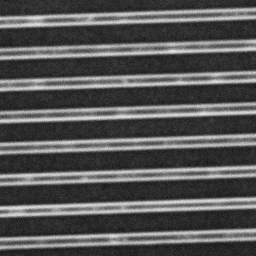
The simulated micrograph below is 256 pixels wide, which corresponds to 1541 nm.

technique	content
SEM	parallel lines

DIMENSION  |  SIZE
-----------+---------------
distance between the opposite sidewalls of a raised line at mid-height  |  0.0511 microns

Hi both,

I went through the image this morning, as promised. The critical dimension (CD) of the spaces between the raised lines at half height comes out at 138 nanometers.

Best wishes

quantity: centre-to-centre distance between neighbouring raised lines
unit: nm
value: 190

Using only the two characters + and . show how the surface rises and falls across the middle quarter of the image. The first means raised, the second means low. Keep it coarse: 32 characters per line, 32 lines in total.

................................
................................
................................
........++++++++++++++++++++++++
++++++++++++++++++++++++++++++++
+++++++++++.....................
................................
................................
................................
................................
................................
....++++++++++++++++++++++++++++
++++++++++++++++++++++++++++++++
+++++++.........................
................................
................................
................................
................................
................................
++++++++++++++++++++++++++++++++
+++++++++++++++++++++++++++++++.
+++.............................
................................
................................
................................
................................
.............................+++
.+++++++++++++++++++++++++++++++
+++++++++++++++++++++++++++.....
................................
................................
................................